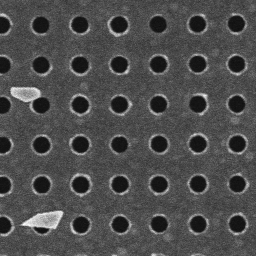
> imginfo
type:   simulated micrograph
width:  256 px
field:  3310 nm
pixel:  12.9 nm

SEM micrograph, a regular array of holes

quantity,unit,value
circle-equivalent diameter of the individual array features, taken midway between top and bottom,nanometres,223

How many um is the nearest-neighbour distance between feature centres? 0.504